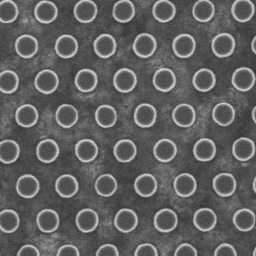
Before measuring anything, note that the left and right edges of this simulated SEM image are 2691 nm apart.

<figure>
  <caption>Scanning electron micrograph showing a regular array of raised bodies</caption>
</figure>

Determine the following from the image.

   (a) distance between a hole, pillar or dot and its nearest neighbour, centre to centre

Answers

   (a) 410 nanometers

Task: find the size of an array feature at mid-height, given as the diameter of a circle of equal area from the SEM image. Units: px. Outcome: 21.8